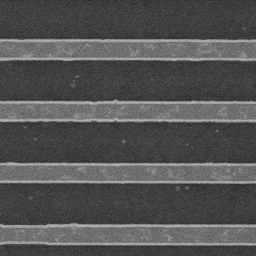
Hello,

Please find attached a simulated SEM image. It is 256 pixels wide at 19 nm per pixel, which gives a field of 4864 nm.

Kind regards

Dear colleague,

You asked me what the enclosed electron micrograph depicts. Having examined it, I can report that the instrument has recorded one or a few lines or trenches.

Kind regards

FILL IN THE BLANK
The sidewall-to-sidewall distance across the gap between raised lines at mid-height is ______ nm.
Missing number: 841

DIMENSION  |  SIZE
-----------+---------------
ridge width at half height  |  336 nm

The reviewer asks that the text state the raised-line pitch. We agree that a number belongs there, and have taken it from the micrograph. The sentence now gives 1170 nm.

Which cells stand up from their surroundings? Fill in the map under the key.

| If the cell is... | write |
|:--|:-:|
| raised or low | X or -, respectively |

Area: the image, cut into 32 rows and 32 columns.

--------------------------------
--------------------------------
--------------------------------
--------------------------------
--------------------------------
XXXXXXXXXXXXXXXXXXXXXXXXXXXXXXXX
XXXXXXXXXXXXXXXXXXXXXXXXXXXXXXXX
--------------------------------
--------------------------------
--------------------------------
--------------------------------
--------------------------------
--------------------------------
XXXXXXXXXXXXXXXXXXXXXXXXXXXXXXXX
XXXXXXXXXXXXXXXXXXXXXXXXXXXXXXXX
--------------------------------
--------------------------------
--------------------------------
--------------------------------
--------------------------------
--------------------------------
XXXXXXXXXXXXXXXXXXXXXXXXXXXXXXXX
XXXXXXXXXXXXXXXXXXXXXXXXXXXXXXXX
--------------------------------
--------------------------------
--------------------------------
--------------------------------
--------------------------------
XXXXXXXXXXXXXXXXXXXXXXXXXXXXXXXX
XXXXXXXXXXXXXXXXXXXXXXXXXXXXXXXX
--------------------------------
--------------------------------